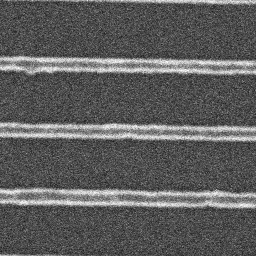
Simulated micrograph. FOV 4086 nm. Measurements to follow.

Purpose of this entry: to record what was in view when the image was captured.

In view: one or a few lines or trenches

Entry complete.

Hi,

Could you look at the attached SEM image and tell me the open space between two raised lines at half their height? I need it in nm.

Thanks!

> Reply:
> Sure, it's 890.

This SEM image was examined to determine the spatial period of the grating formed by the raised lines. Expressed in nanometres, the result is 1060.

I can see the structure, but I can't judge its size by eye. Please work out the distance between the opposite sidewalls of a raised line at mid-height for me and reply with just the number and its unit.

170 nm